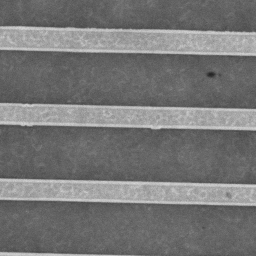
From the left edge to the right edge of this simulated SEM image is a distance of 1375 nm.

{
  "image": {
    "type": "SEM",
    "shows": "one or a few lines or trenches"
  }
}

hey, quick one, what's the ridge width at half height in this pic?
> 104 nanometres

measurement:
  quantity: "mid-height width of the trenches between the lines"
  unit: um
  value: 0.298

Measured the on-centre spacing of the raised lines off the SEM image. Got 406 nanometres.